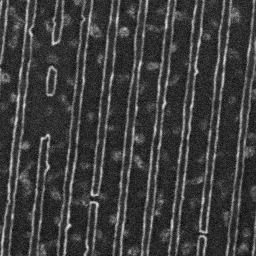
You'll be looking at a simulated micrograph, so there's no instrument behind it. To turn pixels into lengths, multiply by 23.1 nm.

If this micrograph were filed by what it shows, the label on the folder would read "parallel lines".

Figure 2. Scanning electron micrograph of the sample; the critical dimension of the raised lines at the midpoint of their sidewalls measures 0.175 microns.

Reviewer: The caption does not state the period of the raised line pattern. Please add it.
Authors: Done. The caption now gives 0.645 um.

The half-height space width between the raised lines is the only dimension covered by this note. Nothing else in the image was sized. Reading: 470 nm